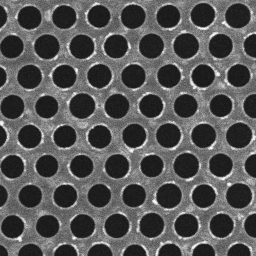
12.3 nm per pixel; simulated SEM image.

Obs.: a regular array of holes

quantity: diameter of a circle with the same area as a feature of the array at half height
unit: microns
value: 0.295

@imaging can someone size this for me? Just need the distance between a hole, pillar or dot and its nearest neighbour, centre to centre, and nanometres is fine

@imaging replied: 419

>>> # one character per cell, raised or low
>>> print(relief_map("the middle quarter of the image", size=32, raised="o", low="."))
..ooooo....ooooo...oooooo...oooo
...ooo......ooo.....oooo.....ooo
...ooo......oo......ooo......ooo
...ooo......oo.......oo......ooo
...ooo.....oooo.....oooo.....ooo
..ooooo....oooo....ooooo....oooo
oooooooooooooooooooooooooooooooo
ooo...ooooooo.ooooooo.oooooooooo
oo.....oooo.....oooo....oooo....
o.......oo......ooo......ooo....
o.......oo.......oo......oo.....
o.......oo......ooo......ooo....
oo.....oooo.....oooo....oooo....
ooo...ooooooo.oooooooooooooooo.o
oooooooooooooooooooooooooooooooo
.ooooooo..oooooo...ooooo....oooo
...oooo....oooo.....ooo......ooo
...ooo......ooo......oo......ooo
...ooo......ooo......oo......ooo
...ooo......ooo.....oooo.....ooo
..ooooo....ooooo...ooooo....oooo
oooooooooooooooooooooooooooooooo
ooooooooooooooooooooooooooooo...
oo....ooooo....ooooo....oooo....
oo.....oooo.....ooo......ooo....
oo.....ooo......ooo......oo.....
oo.....ooo......ooo......ooo....
oo.....oooo....ooooo....oooo....
oooo.ooooooo..ooooooooooooooo...
oooooooooooooooooooooooooooooooo
..ooooo....ooooo...ooooo....oooo
...ooo......ooo.....ooo......ooo